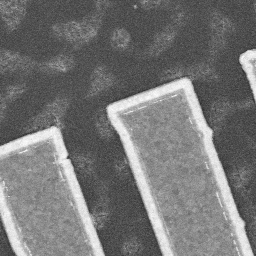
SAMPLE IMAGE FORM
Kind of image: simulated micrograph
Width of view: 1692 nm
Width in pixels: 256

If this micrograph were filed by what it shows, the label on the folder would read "one or a few lines or trenches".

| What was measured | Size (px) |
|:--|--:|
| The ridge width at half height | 73.3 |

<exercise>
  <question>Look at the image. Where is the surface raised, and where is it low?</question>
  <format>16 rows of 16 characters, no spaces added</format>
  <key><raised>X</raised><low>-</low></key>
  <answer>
----------------
----------------
----------------
----------------
----------------
-----------X----
--------XXXX----
-------XXXXX----
--------XXXXX---
XXXX----XXXXX---
XXXX-----XXXXX--
XXXXX----XXXXX--
XXXXX----XXXXX--
XXXXX-----XXXXX-
-XXXXX----XXXXX-
-XXXXX----XXXXX-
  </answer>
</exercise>